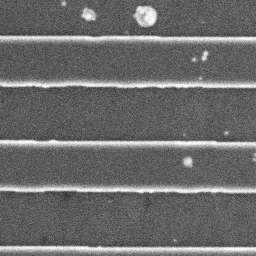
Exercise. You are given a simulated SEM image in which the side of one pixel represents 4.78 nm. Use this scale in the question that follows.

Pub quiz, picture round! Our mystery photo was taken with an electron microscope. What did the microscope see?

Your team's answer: lines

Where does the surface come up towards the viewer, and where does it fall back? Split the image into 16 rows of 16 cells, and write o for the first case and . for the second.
................
................
oooooooooooooooo
oooooooooooooooo
oooooooooooooooo
................
................
................
................
oooooooooooooooo
oooooooooooooooo
oooooooooooooooo
................
................
................
ooooo...........